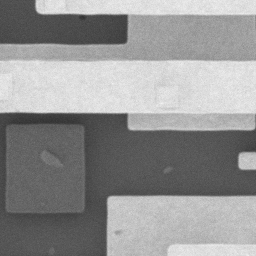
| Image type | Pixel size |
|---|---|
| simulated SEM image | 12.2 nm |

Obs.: wiring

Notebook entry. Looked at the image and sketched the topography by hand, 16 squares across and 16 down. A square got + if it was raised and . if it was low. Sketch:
..++++++++++++++
................
................
................
++++++++++++++++
++++++++++++++++
++++++++++++++++
................
................
................
................
................
................
................
................
...........+++++